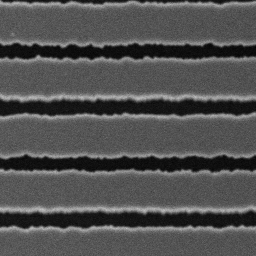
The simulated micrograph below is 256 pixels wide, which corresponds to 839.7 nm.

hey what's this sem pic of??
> lines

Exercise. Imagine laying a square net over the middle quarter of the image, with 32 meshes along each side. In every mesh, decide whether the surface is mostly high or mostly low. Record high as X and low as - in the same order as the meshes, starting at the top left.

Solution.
XXXXXXXXXXXXXXXXXXXXXXXXXXXXXXXX
XXXXXXXXXXXXXXXXXXXXXXXXXXXXXXXX
XXXXXXXXXXXXXXXXXXXXXXXXXXXXXXXX
XXXXXXXXXXXXXXXXXXXXXXXXXXXXXXXX
XXXXXXXXXXXXXXXXXXXXXXXXXXXXXXXX
XXXXXXXXXXXXXXXXXXXXXXXXXXXXXXXX
XXXXXXXXXXXXXXXXXXXXXXXXXXXXXXXX
XXXXXXXXXXXXXXXXXXXXXXXXXXXXXXXX
XXXXXXXXXXXXXXXXXXXXXXXXXXXXXXXX
--------------------------------
--------------------------------
--------------------------------
-----X---------X----------------
XXXXXXXXXXXXXXXXXXXXXXXXXXXXXXXX
XXXXXXXXXXXXXXXXXXXXXXXXXXXXXXXX
XXXXXXXXXXXXXXXXXXXXXXXXXXXXXXXX
XXXXXXXXXXXXXXXXXXXXXXXXXXXXXXXX
XXXXXXXXXXXXXXXXXXXXXXXXXXXXXXXX
XXXXXXXXXXXXXXXXXXXXXXXXXXXXXXXX
XXXXXXXXXXXXXXXXXXXXXXXXXXXXXXXX
XXXXXXXXXXXXXXXXXXXXXXXXXXXXXXXX
XXXXXXXXXXXXXXXXXXXXXXXXXXXXXXXX
XXXXXXXXXXXXXXXXXXXXXXXXXXXXXXXX
--X------X-XXX----------X-X--X--
--------------------------------
--------------------------------
-XX-------------XX--------------
XXXXXXXXXXXXXXXXXXXXXXXXXXXXXXXX
XXXXXXXXXXXXXXXXXXXXXXXXXXXXXXXX
XXXXXXXXXXXXXXXXXXXXXXXXXXXXXXXX
XXXXXXXXXXXXXXXXXXXXXXXXXXXXXXXX
XXXXXXXXXXXXXXXXXXXXXXXXXXXXXXXX